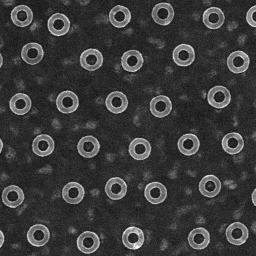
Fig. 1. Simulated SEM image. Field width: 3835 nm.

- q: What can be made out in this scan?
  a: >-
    a regular array of ring-shaped raised bodies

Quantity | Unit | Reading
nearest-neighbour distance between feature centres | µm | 0.66